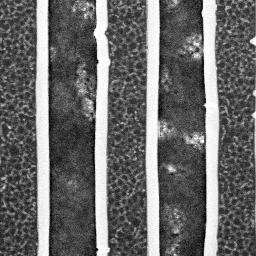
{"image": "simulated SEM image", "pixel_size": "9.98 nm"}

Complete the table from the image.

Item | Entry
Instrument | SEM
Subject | one or a few lines or trenches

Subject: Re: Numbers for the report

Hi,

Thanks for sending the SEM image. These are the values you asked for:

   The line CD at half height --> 508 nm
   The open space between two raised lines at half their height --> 0.585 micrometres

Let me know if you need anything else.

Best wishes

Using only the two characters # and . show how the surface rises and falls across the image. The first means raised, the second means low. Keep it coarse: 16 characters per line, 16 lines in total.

###...####...###
###...####...###
###...####...###
###...####...###
###...####...###
###...###....###
###...###....###
###...###....###
###...###....###
###...###....###
###...###....###
###...####...###
###...####...###
###...####...###
###...####...###
###...####...###